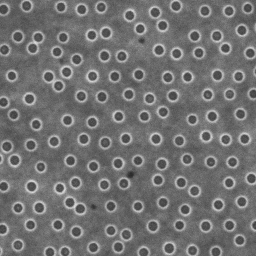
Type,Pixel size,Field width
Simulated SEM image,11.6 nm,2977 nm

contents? a regular array of holes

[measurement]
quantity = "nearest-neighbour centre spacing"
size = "230 nanometers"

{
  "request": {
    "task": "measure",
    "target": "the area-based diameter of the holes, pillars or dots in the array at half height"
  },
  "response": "110 nm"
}